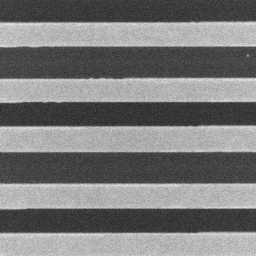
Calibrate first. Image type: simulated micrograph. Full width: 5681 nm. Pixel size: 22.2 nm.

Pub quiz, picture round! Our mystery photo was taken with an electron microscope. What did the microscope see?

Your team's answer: lines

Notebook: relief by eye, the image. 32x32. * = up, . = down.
................................
................................
................................
********************************
********************************
********************************
................................
................................
................................
................................
********************************
********************************
********************************
................................
................................
................................
********************************
********************************
********************************
................................
................................
................................
................................
********************************
********************************
********************************
................................
................................
................................
********************************
********************************
********************************